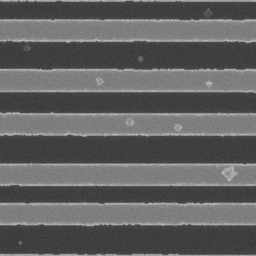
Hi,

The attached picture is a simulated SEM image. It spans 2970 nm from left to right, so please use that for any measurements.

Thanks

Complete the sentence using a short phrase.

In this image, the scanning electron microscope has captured lines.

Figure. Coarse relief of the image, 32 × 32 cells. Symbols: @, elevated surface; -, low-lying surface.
--------------------------------
--------------------------------
@@@@@@@@@@@@@@@@-@@-@@@--@-@--@@
@@@@@@@@@@@@@@@@@@@@@@@@@@@@@@@@
@@@@@@@@@@@@@@@@@@@@@@@@@@@@@@@@
--------------------------------
--------------------------------
--------------------------------
--------------------------------
@@@@@@@@@@@@@@@@@@@@@@@@@@@@@@@@
@@@@@@@@@@@@@@@@@@@@@@@@@@@@@@@@
--------------------------------
--------------------------------
--------------------------------
@@@@@@@@@@@@@@@@@@@@@@@@@@@@@@@@
@@@@@@@@@@@@@@@@@@@@@@@@@@@@@@@@
@@@@@@@@@@@@@@@@@@@@@@@@@@@@@@@@
--------------------------------
--------------------------------
--------------------------------
--------------------------------
@@@@@@@@@@@@@@@@@@@@@@@@@@@@@@@@
@@@@@@@@@@@@@@@@@@@@@@@@@@@@@@@@
--------------------------------
--------------------------------
@@@-@@@@-@@@---@@@-@@@-@---@@@@-
@@@@@@@@@@@@@@@@@@@@@@@@@@@@@@@@
@@@@@@@@@@@@@@@@@@@@@@@@@@@@@@@@
--------------------------------
--------------------------------
--------------------------------
--------------------------------